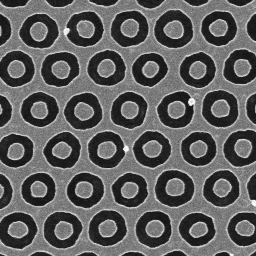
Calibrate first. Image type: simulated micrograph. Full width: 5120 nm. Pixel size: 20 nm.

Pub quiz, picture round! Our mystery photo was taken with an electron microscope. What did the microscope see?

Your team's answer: a regular array of ring-shaped grooves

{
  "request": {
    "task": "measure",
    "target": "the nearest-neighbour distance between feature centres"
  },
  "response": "43.9 pixels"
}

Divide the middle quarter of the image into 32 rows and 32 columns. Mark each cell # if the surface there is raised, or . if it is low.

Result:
#...##...####..##...####..###...
#...##..#####..##...####..###..#
#...##...###...##...###...###..#
...####........##........####...
..######......####......######..
##########..########..##########
################################
####...########...#########....#
##......#####.......#####.......
#........###....#....###...##..#
...###...###...###...##...####..
...####..###..#####..##...####..
...####...##..####...##...####..
...####..###...###..####...##...
#........###........####........
##......######.....#######....##
################################
..######.....#######....########
...####.......#####......#####..
....##.........###...##...###...
#...##...####..##...####...##...
##..##...####..##...####...##..#
#...##...####..##...####...###..
....##....##...###........####..
...####.......####.......######.
..#######....#######...#########
################################
###....########...######.......#
##.......#####......###.........
##..##....###.......###...####..
#..####...##...####..##...####..
#..####...##..#####..##..#####..